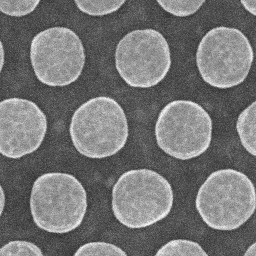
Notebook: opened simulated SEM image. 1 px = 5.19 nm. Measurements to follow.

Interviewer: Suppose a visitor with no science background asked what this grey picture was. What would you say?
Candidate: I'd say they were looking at a regular array of raised bodies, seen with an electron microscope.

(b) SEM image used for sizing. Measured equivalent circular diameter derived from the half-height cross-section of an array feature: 300 nm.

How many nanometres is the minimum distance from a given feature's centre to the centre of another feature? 424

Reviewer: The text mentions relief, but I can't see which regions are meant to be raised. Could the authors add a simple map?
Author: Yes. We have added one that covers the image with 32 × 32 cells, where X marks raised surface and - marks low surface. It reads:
XXXXX-----XXXXX-----XXXXX-----XX
XXXX-------XXX-------XXX-------X
--------------------------------
------XX------------------------
-----XXXXX------XXXX------XXXX--
----XXXXXX-----XXXXXX----XXXXXX-
----XXXXXX-----XXXXXX----XXXXXX-
----XXXXXXX----XXXXXX----XXXXXX-
----XXXXXX-----XXXXXX----XXXXXX-
-----XXXXX-----XXXXX-----XXXXXX-
------XX--------XXX-------XXX---
--------------------------------
-XX---------XX------------------
XXXXX-----XXXXX------XXXX------X
XXXXX----XXXXXXX----XXXXXX----XX
XXXXXX---XXXXXXX----XXXXXX----XX
XXXXXX---XXXXXXX----XXXXXX----XX
XXXXX----XXXXXXX----XXXXXX----XX
XXXX------XXXXX-----XXXXXX-----X
-X---------XX---------XX--------
--------------------------------
----------------XXX--------XX---
-----XXXX------XXXXXX-----XXXXX-
----XXXXXX----XXXXXXX----XXXXXXX
X---XXXXXXX---XXXXXXX----XXXXXXX
X---XXXXXXX---XXXXXXX----XXXXXXX
----XXXXXXX---XXXXXXX----XXXXXXX
----XXXXXX-----XXXXX------XXXXX-
-----XXXX------------------XX---
--------------------------------
-XXX-------XX--------XXX--------
XXXXX-----XXXXX-----XXXXXX-----X